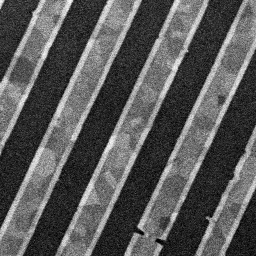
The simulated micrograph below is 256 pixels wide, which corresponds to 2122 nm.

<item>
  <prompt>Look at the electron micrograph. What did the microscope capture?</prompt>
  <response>one or a few lines or trenches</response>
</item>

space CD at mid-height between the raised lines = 296 nm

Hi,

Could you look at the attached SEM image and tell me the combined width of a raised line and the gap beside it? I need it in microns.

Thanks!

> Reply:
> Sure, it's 0.511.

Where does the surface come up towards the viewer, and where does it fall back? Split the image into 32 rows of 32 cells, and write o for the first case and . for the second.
.....oooo.....ooo.....oooo.....o
.....ooo.....oooo....oooo.....oo
....oooo.....ooo.....oooo.....oo
....ooo.....oooo.....ooo.....ooo
...oooo.....ooo.....oooo.....ooo
...ooo.....oooo.....ooo.....oooo
..oooo.....ooo.....oooo.....ooo.
..ooo.....oooo.....ooo.....oooo.
.oooo.....ooo.....oooo.....ooo..
.ooo.....oooo.....oooo....oooo..
oooo.....oooo....oooo.....oooo..
ooo.....oooo.....oooo....oooo...
ooo.....ooo.....oooo.....oooo...
oo.....oooo.....oooo....oooo....
oo.....oooo....oooo.....oooo....
o......ooo.....oooo.....ooo.....
o.....oooo....oooo.....oooo.....
o.....ooo.....oooo.....ooo.....o
.....oooo.....ooo.....oooo.....o
.....ooo.....oooo.....ooo......o
....oooo.....ooo.....oooo.....oo
....ooo.....oooo.....ooo......oo
...oooo.....ooo.....oooo.....ooo
...ooo.....oooo.....ooo......ooo
..oooo.....ooo.....oooo.....ooo.
..ooo.....oooo.....ooo......ooo.
.oooo.....oooo....oooo.....ooo..
.ooo.....oooo.....oooo.....ooo..
oooo.....oooo.....ooo.....ooo...
oooo....oooo.....oooo.....ooo...
ooo.....oooo....oooo.....ooo....
ooo....oooo.....oooo.....ooo....